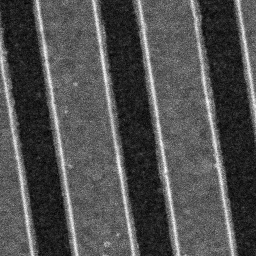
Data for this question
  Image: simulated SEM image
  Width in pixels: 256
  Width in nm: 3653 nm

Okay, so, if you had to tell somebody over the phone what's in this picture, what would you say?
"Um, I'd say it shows one or a few lines or trenches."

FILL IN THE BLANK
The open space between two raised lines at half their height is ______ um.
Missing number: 0.653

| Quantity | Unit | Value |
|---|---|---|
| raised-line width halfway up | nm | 771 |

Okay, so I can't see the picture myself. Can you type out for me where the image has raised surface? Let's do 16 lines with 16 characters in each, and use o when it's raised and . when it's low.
..oooo...ooo...o
...ooo...ooo...o
...ooo...ooo...o
...ooo...oooo..o
...oooo..oooo...
...oooo...ooo...
o..oooo...ooo...
o...ooo...ooo...
o...ooo...ooo...
o...ooo...oooo..
o...ooo...oooo..
o...oooo...ooo..
o...oooo...ooo..
oo..oooo...ooo..
oo...ooo...ooo..
oo...ooo...ooo..